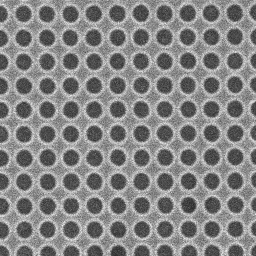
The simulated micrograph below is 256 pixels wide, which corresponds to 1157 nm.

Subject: a regular array of holes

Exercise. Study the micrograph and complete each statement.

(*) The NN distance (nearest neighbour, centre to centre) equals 0.105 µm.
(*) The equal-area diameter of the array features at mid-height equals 17.6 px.